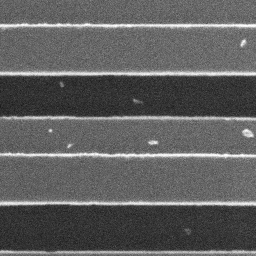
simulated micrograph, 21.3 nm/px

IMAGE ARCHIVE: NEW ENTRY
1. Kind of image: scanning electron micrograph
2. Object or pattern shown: lines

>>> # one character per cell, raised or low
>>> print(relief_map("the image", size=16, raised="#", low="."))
################
################
################
################
################
................
................
################
################
################
################
################
################
................
................
................